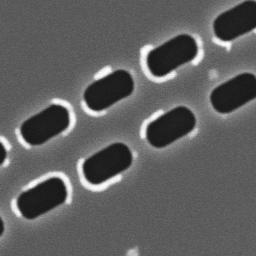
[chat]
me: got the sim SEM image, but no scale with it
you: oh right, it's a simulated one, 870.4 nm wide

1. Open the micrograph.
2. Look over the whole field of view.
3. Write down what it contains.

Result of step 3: holes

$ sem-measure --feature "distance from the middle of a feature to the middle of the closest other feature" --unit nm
245